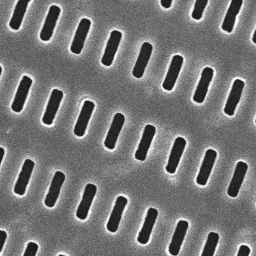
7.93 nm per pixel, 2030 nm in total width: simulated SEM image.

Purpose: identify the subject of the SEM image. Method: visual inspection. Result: a regular array of holes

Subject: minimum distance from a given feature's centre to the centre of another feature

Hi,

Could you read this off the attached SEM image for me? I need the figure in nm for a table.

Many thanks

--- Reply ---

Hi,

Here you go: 262